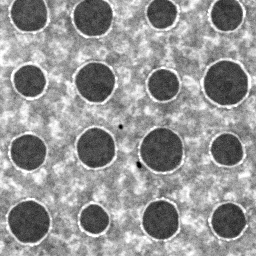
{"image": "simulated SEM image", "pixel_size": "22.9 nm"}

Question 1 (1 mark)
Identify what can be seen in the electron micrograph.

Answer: a regular array of raised bodies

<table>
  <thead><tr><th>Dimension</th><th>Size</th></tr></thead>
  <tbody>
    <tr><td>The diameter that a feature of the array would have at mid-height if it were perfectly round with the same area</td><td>888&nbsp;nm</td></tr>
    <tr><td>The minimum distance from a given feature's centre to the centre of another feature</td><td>1500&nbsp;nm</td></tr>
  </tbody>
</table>